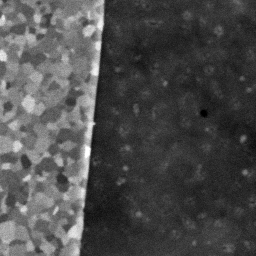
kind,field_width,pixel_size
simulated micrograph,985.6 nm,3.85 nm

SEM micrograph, one or a few lines or trenches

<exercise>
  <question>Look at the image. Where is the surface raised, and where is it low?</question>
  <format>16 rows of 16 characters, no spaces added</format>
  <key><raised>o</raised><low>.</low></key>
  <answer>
oooooo..........
oooooo..........
oooooo..........
oooooo..........
oooooo..........
oooooo..........
oooooo..........
oooooo..........
oooooo..........
oooooo..........
ooooo...........
ooooo...........
ooooo...........
ooooo...........
ooooo...........
ooooo...........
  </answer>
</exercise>